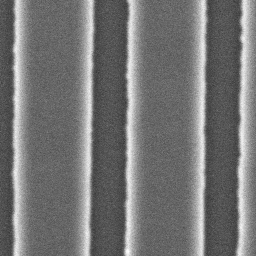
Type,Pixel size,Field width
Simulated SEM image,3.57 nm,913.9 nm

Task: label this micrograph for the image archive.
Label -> lines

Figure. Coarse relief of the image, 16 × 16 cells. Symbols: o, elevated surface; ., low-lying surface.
.ooooo..ooooo..o
.ooooo..ooooo..o
.ooooo..ooooo..o
.ooooo..ooooo..o
.ooooo..ooooo..o
.ooooo..ooooo..o
.ooooo..ooooo..o
.ooooo..ooooo..o
.ooooo..ooooo..o
.ooooo..ooooo..o
.ooooo..ooooo..o
.ooooo..ooooo..o
.ooooo..ooooo..o
.ooooo..ooooo..o
.ooooo..ooooo..o
.ooooo..ooooo..o